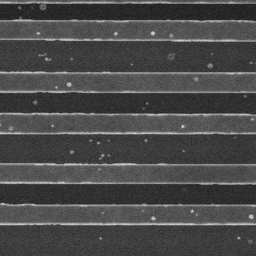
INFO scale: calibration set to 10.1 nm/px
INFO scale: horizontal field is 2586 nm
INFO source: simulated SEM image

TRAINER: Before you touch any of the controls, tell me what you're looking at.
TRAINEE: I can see lines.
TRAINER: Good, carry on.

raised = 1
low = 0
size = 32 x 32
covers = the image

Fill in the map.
00000000000000000000000000000000
00000000000000000000000000000000
00000000000000000000000000000000
11111111111111111111111111111111
11111111111111111111111111111111
00000000000000000000000000000000
00000000000000000000000000000000
00000000000000000000000000000000
00000000000000000000000000000000
11111111111111111111111111111111
11111111111111111111111111111111
11111111101111111111111111111111
00000000000000000000000000000000
00000000000000000000000000000000
11111111111111111111111111111111
11111111111111111111111111111111
11111111111111111111111111111111
00000000000000000000000000000000
00000000000000000000000000000000
00000000000000000000000000000000
00000000000000000000000000000000
11111111111111111111111111111111
11111111111111111111111111111111
00000000000000000000000000000000
00000000000000000000000000000000
10000000000000000000000000000000
11111111111111111111111111111111
11111111111111111111111111111111
00000000000000000000000000000000
00000000000000000000000000000000
00000000000000000000000000000000
00000000000000000000000000000000